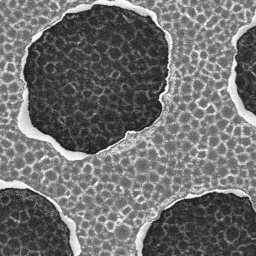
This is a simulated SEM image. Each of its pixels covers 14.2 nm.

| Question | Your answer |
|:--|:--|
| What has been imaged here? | holes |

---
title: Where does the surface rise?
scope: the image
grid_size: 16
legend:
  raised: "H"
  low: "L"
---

HHHHHLLLHHHHHHHH
HHHLLLLLLLHHHHHH
HHLLLLLLLLLHHHHL
HHLLLLLLLLLHHHHL
HLLLLLLLLLHHHHHL
HHLLLLLLLLHHHHHL
HHLLLLLLLLHHHHHL
HLLLLLLLLLHHHHHH
HHHLLLLLHHHHHHHH
HHHHLLHHHHHHHHHH
HHHHHHHHHHHHHHHH
HHHHHHHHHHHHHHHH
LLLHHHHHHHHLLLLL
LLLLHHHHHHLLLLLL
LLLLLHHHHLLLLLLL
LLLLLHHHHLLLLLLL